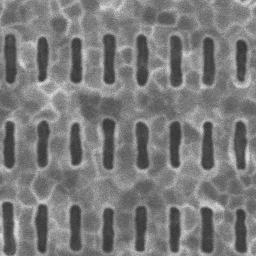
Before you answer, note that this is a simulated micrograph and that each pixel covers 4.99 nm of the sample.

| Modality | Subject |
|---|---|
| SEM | a regular array of holes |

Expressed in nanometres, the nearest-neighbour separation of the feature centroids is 163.